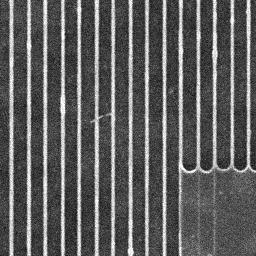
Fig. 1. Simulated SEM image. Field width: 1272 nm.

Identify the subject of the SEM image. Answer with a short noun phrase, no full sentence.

parallel lines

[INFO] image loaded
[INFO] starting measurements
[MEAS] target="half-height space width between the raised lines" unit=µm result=0.0689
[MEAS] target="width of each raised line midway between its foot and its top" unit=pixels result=2.62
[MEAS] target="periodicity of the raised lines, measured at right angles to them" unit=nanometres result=84.3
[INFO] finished